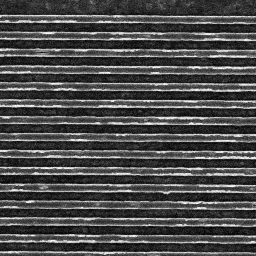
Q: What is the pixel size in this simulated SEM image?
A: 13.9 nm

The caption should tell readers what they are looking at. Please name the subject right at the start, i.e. parallel lines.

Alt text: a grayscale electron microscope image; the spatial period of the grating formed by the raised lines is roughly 234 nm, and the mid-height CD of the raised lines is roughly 0.106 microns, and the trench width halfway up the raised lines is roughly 9.37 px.